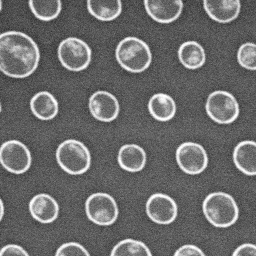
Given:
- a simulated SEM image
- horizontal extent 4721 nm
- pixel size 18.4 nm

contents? a regular array of raised bodies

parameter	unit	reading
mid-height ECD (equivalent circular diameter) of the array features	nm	533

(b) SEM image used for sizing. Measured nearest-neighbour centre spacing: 1080 nanometres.